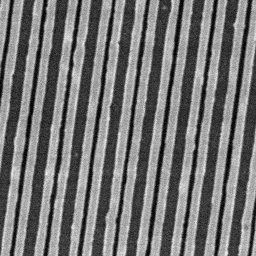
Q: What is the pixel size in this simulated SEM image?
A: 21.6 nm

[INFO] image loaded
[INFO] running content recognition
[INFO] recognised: parallel lines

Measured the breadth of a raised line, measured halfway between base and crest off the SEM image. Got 0.161 microns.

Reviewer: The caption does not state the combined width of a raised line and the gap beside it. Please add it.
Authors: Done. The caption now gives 0.363 um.